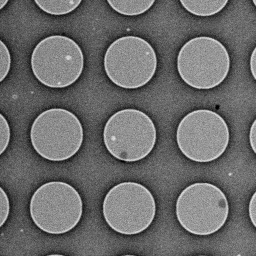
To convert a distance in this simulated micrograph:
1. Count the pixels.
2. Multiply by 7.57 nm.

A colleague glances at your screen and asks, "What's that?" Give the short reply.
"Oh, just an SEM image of an array of small figures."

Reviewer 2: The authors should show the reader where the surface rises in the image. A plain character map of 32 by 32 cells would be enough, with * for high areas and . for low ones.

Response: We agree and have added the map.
*....*****....*****....*****....
......***......***......***.....
................................
................................
................................
.....****.....*****....*****....
*...******...******....*****....
*...******...******...*******..*
*...******...******...*******..*
*....*****....*****....*****....
......***......***......***.....
................................
................................
................................
.....****.....****.....****.....
*...******...******....*****....
*...******...******...*******..*
*...******...******...*******..*
*...******...******....*****....
.....****.....****.....****.....
................................
................................
................................
.....****.....****.....****.....
*...******...******....*****....
*...******...******...******...*
*...******...******...******...*
*...******...******...******...*
.....****.....****.....****.....
................................
................................
................................